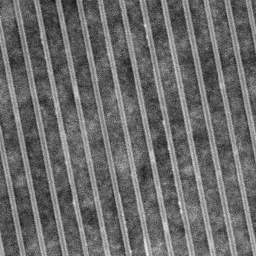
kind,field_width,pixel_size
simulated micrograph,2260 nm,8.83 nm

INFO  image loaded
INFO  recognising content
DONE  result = parallel lines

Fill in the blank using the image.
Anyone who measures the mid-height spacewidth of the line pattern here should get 143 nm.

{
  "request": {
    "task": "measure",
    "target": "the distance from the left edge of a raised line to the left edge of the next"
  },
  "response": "183 nanometres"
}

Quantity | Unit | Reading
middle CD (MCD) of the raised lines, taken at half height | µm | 0.0358